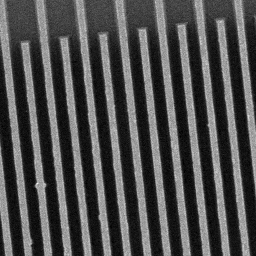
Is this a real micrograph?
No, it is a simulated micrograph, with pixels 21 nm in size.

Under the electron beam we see parallel lines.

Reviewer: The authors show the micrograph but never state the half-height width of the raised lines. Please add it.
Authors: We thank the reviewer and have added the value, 185 nanometers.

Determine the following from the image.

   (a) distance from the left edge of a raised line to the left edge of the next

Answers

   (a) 19.7 pixels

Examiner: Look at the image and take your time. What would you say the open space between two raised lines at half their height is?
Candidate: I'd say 0.224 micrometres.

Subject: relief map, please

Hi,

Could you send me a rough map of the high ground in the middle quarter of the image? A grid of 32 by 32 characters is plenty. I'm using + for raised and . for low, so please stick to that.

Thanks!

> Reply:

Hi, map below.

++...++...++...++...++..+++..++.
++...++...++...++...++...++..+++
++...++...++...++...++...++...++
++...++...++...++...++...++...++
++...++...++...++...++...++...++
++...++...++...++...++...++...++
++...++...++...++...++...++...++
+++..++...+++..++...++...++...++
.++...+....++..+++..++...++...++
.++...++...++...++...++..++...++
.++...++...++...++...++...++..++
.++...++...++...++...++...++...+
.++...++...++...++...++...++...+
.++...++...++...++...++...++...+
.++...++...++...++...++...++...+
.++...++...++...++...++...++...+
.++...++...++...++...++...++...+
..++...+....+...+++..++...++...+
..++...++...++...++...++..++...+
..++...++...++...++...++...++..+
..++...++...++...++...++...++...
..++...++...++...++...++...++...
..++...++...++...++...++...++...
..++...++...++...++...++...++...
...+...++...++...++...++...++...
..++...++...++...++...++...++...
...++...+...++...+++..++...+++..
...++...++...++...++...++..++...
...++...++...++...++...++...++..
...++...++...++...++...++...++..
...++...++...++...++...++...++..
...++...++...++...++...++...++..